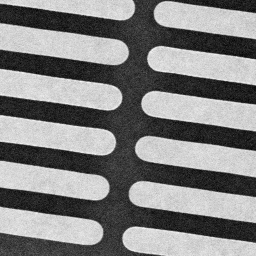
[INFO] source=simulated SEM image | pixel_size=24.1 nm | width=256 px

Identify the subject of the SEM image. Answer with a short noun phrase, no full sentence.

groups of lines, slits or small figures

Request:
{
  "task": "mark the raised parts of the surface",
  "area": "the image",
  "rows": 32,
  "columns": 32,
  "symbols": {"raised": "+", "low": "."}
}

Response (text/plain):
.++++++++++++++++...+++.........
........+++++++++..++++++++++++.
....................++++++++++++
++++..................++++++++++
+++++++++++..................+++
++++++++++++++++................
...+++++++++++++...++++++.......
..........++++++..++++++++++++++
...................+++++++++++++
+++++...................++++++++
+++++++++++++..................+
+++++++++++++++....+............
....+++++++++++...+++++++++.....
...........+++....++++++++++++++
...................+++++++++++++
++++++++..................++++++
++++++++++++++..................
++++++++++++++...+++++..........
......++++++++...++++++++++++...
.................+++++++++++++++
+++..................+++++++++++
+++++++++...................++++
+++++++++++++...................
.+++++++++++++..+++++++.........
........+++++...+++++++++++++++.
.................+++++++++++++++
++++..................++++++++++
+++++++++++..................+++
+++++++++++++...++..............
...++++++++++..+++++++++++......
..........++....++++++++++++++++
.................+++++++++++++++